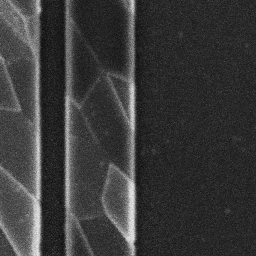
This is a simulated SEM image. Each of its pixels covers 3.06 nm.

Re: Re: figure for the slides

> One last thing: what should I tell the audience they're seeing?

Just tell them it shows one or a few lines or trenches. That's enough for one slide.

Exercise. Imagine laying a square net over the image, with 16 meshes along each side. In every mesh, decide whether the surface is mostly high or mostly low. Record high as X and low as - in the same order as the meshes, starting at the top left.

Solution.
XX--XXXX--------
XX--XXXX--------
XX--XXXX--------
XX--XXXX--------
XX--XXXX--------
XX--XXXX--------
XX--XXXX--------
XX--XXXX--------
XX--XXXX--------
XX--XXXX--------
XX--XXXX--------
XX--XXXX--------
XX--XXXX--------
XX--XXXX--------
XX--XXXX--------
XX--XXXX--------